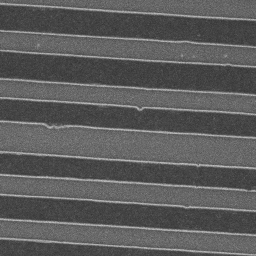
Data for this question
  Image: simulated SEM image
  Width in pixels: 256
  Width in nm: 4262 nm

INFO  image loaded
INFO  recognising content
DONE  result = parallel lines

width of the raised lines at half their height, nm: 418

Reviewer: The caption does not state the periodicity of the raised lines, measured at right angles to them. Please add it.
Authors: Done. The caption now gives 47.3 px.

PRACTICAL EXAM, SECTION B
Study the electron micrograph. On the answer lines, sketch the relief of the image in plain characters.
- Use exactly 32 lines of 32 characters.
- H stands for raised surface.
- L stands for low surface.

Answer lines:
LLLLLLLLLLLLLLLLLLLLLLLLLLLLLLLL
HHHHHHHHHHHHHHLLLLLLLLLLLLLLLLLL
HHHHHHHHHHHHHHHHHHHHHHHHHHHHHHHL
HHHHHHHHHHHHHHHHHHHHHHHHHHHHHHHH
LLLLLLLLLLLHHHHHHHHHHHHHHHHHHHHH
LLLLLLLLLLLLLLLLLLLLLLLLLLLHHHHH
HLLLLLLLLLLLLLLLLLLLLLLLLLLLLLLL
HHHHHHHHHHHHHHHHHLLLLLLLLLLLLLLL
HHHHHHHHHHHHHHHHHHHHHHHHHHHHHHHH
HHHHHHHHHHHHHHHHHHHHHHHHHHHHHHHH
LLLLLLLLLLHHHHHHHHHHHHHHHHHHHHHH
LLLLLLLLLLLLLLLLLLLLLLLLLLHHHHHH
HHHHLLLLLLLLLLLLLLLLLLLLLLLLLLLL
HHHHHHHHHHHHHHHHHLLLLLLLLLLLLLLL
HHHHHHHHHHHHHHHHHHHHHHHHHHHHHHHH
LLLLLHHHHHHHHHHHHHHHHHHHHHHHHHHH
LLLLLLLLLLLLLLLLLLLLLHHHHHHHHHHH
LLLLLLLLLLLLLLLLLLLLLLLLLLLLLLLL
LLLLLLLLLLLLLLLLLLLLLLLLLLLLLLLL
HHHHHHHHLLLLLLLLLLLLLLLLLLLLLLLL
HHHHHHHHHHHHHHHHHHHHHHLLLLLLLLLL
HHHHHHHHHHHHHHHHHHHHHHHHHHHHHHHH
LLLLLLLLLLHHHHHHHHHHHHHHHHHHHHHH
LLLLLLLLLLLLLLLLLLLLLLLLLLLLHHHH
HHHLLLLLLLLLLLLLLLLLLLLLLLLLLLLL
HHHHHHHHHHHHHHHHHHLLLLLLLLLLLLLL
HHHHHHHHHHHHHHHHHHHHHHHHHHHHHHHH
LLHHHHHHHHHHHHHHHHHHHHHHHHHHHHHH
LLLLLLLLLLLLLLLLLLHHHHHHHHHHHHHH
LLLLLLLLLLLLLLLLLLLLLLLLLLLLLLLL
HHHHHHHHHHLLLLLLLLLLLLLLLLLLLLLL
HHHHHHHHHHHHHHHHHHHHHHHHHLLLLLLL